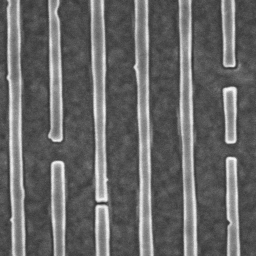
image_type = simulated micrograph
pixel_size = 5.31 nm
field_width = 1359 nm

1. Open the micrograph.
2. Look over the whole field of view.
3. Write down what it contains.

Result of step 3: parallel lines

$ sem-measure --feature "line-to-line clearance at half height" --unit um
0.175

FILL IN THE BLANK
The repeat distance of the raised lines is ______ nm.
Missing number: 228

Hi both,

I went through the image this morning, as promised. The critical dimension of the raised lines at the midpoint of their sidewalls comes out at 55.1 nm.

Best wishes